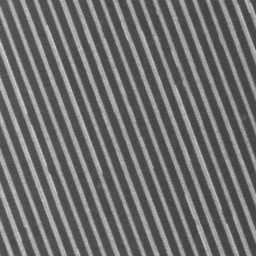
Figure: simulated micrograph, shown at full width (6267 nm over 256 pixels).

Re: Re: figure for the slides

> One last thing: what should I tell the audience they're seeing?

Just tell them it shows parallel lines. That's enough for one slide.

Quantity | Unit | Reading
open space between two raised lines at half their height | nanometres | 215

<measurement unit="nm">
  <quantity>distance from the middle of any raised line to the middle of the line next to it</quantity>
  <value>304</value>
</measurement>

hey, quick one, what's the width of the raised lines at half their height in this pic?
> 91.8 nm